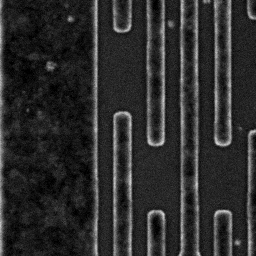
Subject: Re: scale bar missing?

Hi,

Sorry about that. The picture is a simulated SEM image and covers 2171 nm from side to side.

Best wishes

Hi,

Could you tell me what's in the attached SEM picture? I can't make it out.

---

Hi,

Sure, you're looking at wiring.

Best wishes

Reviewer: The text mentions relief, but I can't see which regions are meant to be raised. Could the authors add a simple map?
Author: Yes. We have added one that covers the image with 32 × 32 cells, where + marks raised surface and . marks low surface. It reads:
++++++++++++..++..++...++..++..+
++++++++++++..++..++...++..++..+
++++++++++++..++...+...++..++...
++++++++++++..++...+...++..++...
++++++++++++.......+...++..++...
++++++++++++......++...++..++...
++++++++++++......++...++..++...
++++++++++++......++...++..++...
++++++++++++......++...++..++...
++++++++++++.......+...++..++...
++++++++++++.......+...++..++...
++++++++++++.......+...++..++...
++++++++++++.......+...++..++...
++++++++++++.......+...++..++...
++++++++++++..++...+...++..++...
++++++++++++..++...+...++..++...
++++++++++++..++...+...++..++...
++++++++++++..++...+...++..++..+
++++++++++++..++.......++......+
++++++++++++..++.......++......+
++++++++++++..++.......++......+
++++++++++++..++.......++......+
++++++++++++..++.......++......+
++++++++++++..++.......++......+
++++++++++++..++.......++......+
++++++++++++..++.......++......+
++++++++++++..++...+...++..++..+
++++++++++++..++...+...++..++..+
++++++++++++..++...+...++..++..+
++++++++++++..++...+...++..++..+
++++++++++++..++...+...++..++..+
++++++++++++..++...+...++..++..+